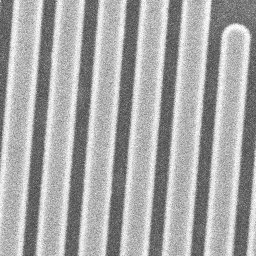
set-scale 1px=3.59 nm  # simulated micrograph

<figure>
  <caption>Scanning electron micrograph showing parallel lines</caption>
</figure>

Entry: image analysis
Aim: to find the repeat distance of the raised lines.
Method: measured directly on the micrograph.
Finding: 150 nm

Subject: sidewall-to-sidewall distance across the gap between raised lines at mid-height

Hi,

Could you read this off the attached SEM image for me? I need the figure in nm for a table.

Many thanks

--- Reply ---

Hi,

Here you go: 67.5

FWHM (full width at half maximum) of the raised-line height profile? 23.4 px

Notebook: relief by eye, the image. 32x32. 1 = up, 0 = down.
00111001110001100011100111000000
00111001110001100011100111000000
00111001110001100011100111000000
00111001110011100011100111000100
00111001110011100011000111001110
00111001110011100111000111001110
00111001110011100111000111001110
01110001110011100111000110001110
01110001110011100111001110001110
01110001100011100111001110001110
01110001100011100111001110001110
01110001100011100111001110011100
01110011100011000111001110011100
01110011100011000111001110011100
01110011100011000111001110011100
01110011100111000111001110011100
01110011100111000110001110011100
01110011100111001110001110011100
01110011100111001110001110011100
11100011100111001110001110011100
11100011100111001110001100011100
11100011000111001110011100011100
11100011000111001110011100011100
11100011000111001110011100011000
11100111000111001110011100011000
11100111000110001110011100111000
11100111000110001110011100111000
11100111001110001110011100111000
11100111001110001100011100111001
11100111001110001100011100111001
11100111001110011100011100111001
11000111001110011100011100111001